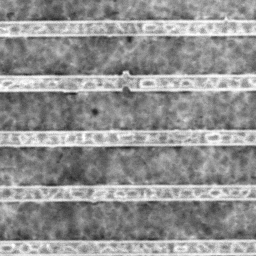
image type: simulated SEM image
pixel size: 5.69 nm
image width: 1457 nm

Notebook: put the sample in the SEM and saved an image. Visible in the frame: parallel lines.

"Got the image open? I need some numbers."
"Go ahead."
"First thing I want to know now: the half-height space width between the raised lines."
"0.234 um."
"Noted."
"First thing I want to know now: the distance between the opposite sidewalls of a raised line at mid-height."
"0.0797 microns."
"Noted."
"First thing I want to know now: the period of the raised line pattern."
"54.9 pixels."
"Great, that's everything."